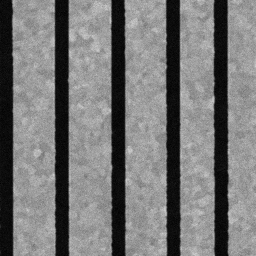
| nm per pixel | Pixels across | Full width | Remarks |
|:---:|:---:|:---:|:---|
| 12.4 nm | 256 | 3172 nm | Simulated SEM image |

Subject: lines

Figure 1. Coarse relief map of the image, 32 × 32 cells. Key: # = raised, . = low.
..#####..#####..#####..####..###
..#####..#####..#####..####..###
..#####..#####..#####..####..###
..#####..#####..#####..####..###
..#####..#####..#####..####..###
..#####..#####..#####..####..###
..#####..#####..#####..####..###
..#####..#####..#####..####..###
..#####..#####..#####..####..###
..#####..#####..#####..####..###
..#####..#####..#####..####..###
..#####..#####..#####..####..###
..#####..#####..#####..####..###
..#####..#####..#####..####..###
..#####..#####..#####..####..###
..#####..#####..#####..####..###
..#####..#####..#####..####..###
..#####..#####..#####..####..###
..#####..#####..#####..####..###
..#####..#####..#####..####..###
..#####..#####..#####..####..###
..#####..#####..#####..####..###
..#####..#####..#####..####..###
..#####..#####..#####..####..###
..#####..#####..#####..####..###
..#####..#####..#####..####..###
..#####..#####..#####..####..###
..#####..#####..#####..####..###
..#####..#####..#####..####..###
..#####..#####..#####..####..###
..#####..#####..#####..####..###
..#####..#####..#####..####..###